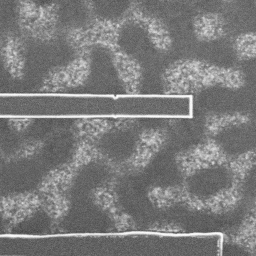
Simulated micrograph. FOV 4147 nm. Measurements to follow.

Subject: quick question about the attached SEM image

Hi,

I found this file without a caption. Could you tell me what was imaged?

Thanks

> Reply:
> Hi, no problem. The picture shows one or a few lines or trenches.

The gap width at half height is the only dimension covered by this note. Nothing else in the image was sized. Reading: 1910 nm